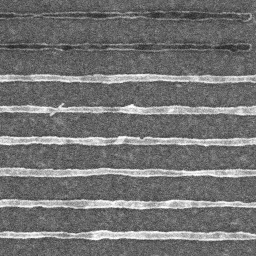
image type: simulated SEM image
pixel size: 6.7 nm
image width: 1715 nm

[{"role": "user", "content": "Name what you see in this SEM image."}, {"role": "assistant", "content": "parallel lines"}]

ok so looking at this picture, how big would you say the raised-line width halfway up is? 5.75 px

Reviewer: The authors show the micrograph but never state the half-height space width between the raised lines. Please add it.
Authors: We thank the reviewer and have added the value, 172 nanometres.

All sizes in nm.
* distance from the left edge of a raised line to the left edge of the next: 210